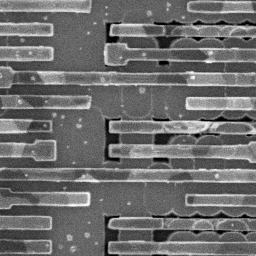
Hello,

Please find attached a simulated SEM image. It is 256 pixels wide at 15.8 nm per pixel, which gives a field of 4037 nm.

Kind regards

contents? wiring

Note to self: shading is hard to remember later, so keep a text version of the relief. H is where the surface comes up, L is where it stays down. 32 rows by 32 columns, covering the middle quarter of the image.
LLLLLLLLLLLLLLLLLLLLLLLLLLLLLLLL
LLLLLLLLLLLLLLLLLLLLLLLLLLLLLLLL
HHHHHHHHHHHHHHHHHHHHHHHHHHHHHHHH
HHHHHHHHHHHHHHHHHHHHHHHHHHHHHHHH
HHHHHHHHHHHHHHHHHHHHHHHHHHHHHHHH
LLLLLLLLLLLLLLLLLLLLLLLLLLLLLLLL
LLLLLLLLLLLLLLLLLLLLLLLLLLLLLLLL
LLLLLLLLLLLLLLLLLLLLLLLLLLLLLLLL
HHHHHHHLLLLLLLLLLLLLLLLLLLLLLLLH
HHHHHHHLLLLLLLLLLLLLLLLLLLLLLLLH
HHHHHHLLLLLLLLLLLLLLLLLLLLLLLLLH
LLLLLLLLLLLLLLLLLLLLLLLLLLLLLLLL
LLLLLLLLLLLLLLLLLLLLLLLLLLLLLLLL
LLLLLLLLLLLLLLLLLLLLLLLLLLLLLLLL
LLLLLLLLLLLLHHHHHHHHLLLLLLLLLLLL
LLLLLLLLLLLLHHHHHHHHHHHHHHHHHHHH
LLLLLLLLLLLLHHHHHHHHHHHHHHHHHHHH
LLLLLLLLLLLLLLLLLLLLLLLLLLLLLLLL
LLLLLLLLLLLLLLLLLLLLLLLLLLLLLLLL
LLLLLLLLLLLLLLLLLLLLLLLLLLLLLLLL
LLLLLLLLLLLLHHHHHHHHHHHLLLHHHHHH
LLLLLLLLLLLLHHHHHHHHHHHHHHHHHHHH
LLLLLLLLLLLLHHHHHHHHHHHHHHHHHHHH
LLLLLLLLLLLLLLLLLLLLLLLLLLLLLLLL
LLLLLLLLLLLLLLLLLLLLLLLLLLLLLLLL
LLLLLLLLLLLLLLLLLLLLLLLLLLLLLLLL
HHHHHHHHHHHHHHLLLLLLLLLLLLLLLLLL
HHHHHHHHHHHHHHHHHHHHHHHHHHHHHHHH
HHHHHHHHHHHHHHHHHHHHHHHHHHHHHHHH
LLLLLLLLLLLLLLLLLLLLLLLLLLLLLLLL
LLLLLLLLLLLLLLLLLLLLLLLLLLLLLLLL
LLLLLLLLLLLLLLLLLLLLLLLLLLLLLLLL